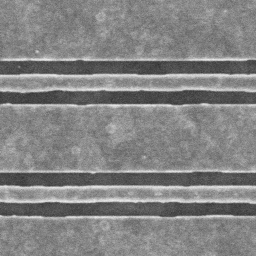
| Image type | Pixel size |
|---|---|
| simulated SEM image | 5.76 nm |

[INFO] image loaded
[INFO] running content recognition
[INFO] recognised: lines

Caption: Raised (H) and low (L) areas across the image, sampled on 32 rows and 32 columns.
HHHHHHHHHHHHHHHHHHHHHHHHHHHHHHHH
HHHHHHHHHHHHHHHHHHHHHHHHHHHHHHHH
HHHHHHHHHHHHHHHHHHHHHHHHHHHHHHHH
HHHHHHHHHHHHHHHHHHHHHHHHHHHHHHHH
HHHHHHHHHHHHHHHHHHHHHHHHHHHHHHHH
HHHHHHHHHHHHHHHHHHHHHHHHHHHHHHHH
HHHHHHHHHHHHHHHHHHHHHHHHHHHHHHHH
LLLLLLLLLLLLLLLLLLLLLLLLLLLLLLLL
LLLLLLLLLLLLLLLLLLLLLLLLLLLLLLLL
LLHHHHHLLLLLHHLHHLLLHHHHHHHHHHHH
HHHHHHHHHHHHHHHHHHHHHHHHHHHHHHHH
LLLLLLLLLLLLLLLLLLLLLLLLLLLLLLLL
LLLLLLLLLLLLLLLLLLLLLLLLLLLLLLLL
HHHHHHHHHHHHHHHHHHHHHHHHHHHHHHHH
HHHHHHHHHHHHHHHHHHHHHHHHHHHHHHHH
HHHHHHHHHHHHHHHHHHHHHHHHHHHHHHHH
HHHHHHHHHHHHHHHHHHHHHHHHHHHHHHHH
HHHHHHHHHHHHHHHHHHHHHHHHHHHHHHHH
HHHHHHHHHHHHHHHHHHHHHHHHHHHHHHHH
HHHHHHHHHHHHHHHHHHHHHHHHHHHHHHHH
HHHHHHHHHHHHHHHHHHHHHHHHHHHHHHHH
LLLLLLLLLLLLLLLLLLLLLLLLLLLLLLLL
LLLLLLLLLLLLLLLLLLLLLLLLLLLLLLLL
HHHLLLLLHHHHHHHHHHHHHHLLHHHHHHHH
HHHHHHHHHHHHHHHHHHHHHHHHHHHHHHHH
LLLLLLLLLLLLLLLLLLLLLLLLLLLLLLLL
LLLLLLLLLLLLLLLLLLLLLLLLLLLLLLLL
HHHHHHHHHHHHHHHHHHHHHHHHHHHHHHHH
HHHHHHHHHHHHHHHHHHHHHHHHHHHHHHHH
HHHHHHHHHHHHHHHHHHHHHHHHHHHHHHHH
HHHHHHHHHHHHHHHHHHHHHHHHHHHHHHHH
HHHHHHHHHHHHHHHHHHHHHHHHHHHHHHHH